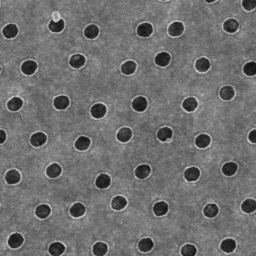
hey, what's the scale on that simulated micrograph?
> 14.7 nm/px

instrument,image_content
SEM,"a regular array of holes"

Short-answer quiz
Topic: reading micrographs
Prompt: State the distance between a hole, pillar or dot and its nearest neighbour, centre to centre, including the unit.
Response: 0.526 micrometres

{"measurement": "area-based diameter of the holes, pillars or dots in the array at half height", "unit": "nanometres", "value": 238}